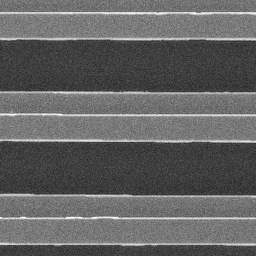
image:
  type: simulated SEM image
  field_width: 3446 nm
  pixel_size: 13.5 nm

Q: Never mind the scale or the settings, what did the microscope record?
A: lines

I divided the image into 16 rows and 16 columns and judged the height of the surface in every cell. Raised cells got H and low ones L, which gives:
HHHHHHHHHHHHHHHH
HHHHHHHHHHHHHHHH
LLLLLLLLLLLLLLLL
LLLLLLLLLLLLLLLL
LLLLLLLLLLLLLLLL
LLLLLLLLLLLLLLLL
HHHHHHHHHHHHHHHH
HHHHHHHHHHHHHHHH
HHHHHHHHHHHHHHHH
LLLLLLLLLLLLLLLL
LLLLLLLLLLLLLLLL
LLLLLLLLLLLLLLLL
HHHHHHHHHHHHHHHH
HHHHHHHHHHHHHHHH
HHHHHHHHHHHHHHHH
LLLLLLLLLLLLLLLL